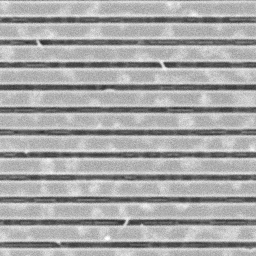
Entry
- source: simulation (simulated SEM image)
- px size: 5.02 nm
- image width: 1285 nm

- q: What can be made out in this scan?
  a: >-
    parallel lines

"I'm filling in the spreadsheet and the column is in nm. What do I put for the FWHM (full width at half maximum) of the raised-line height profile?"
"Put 82.8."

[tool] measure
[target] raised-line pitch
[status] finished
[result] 0.113 microns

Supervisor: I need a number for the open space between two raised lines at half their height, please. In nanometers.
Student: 30.7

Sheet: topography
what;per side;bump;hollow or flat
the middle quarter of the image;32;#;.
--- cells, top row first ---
................................
################################
################################
################################
################################
................................
................................
################################
################################
################################
###..............####..#........
................................
################################
################################
################################
################################
................................
................................
################################
################################
################################
################################
................................
................................
################################
################################
################################
................................
................................
################################
################################
################################